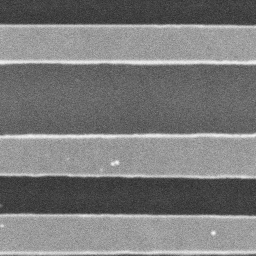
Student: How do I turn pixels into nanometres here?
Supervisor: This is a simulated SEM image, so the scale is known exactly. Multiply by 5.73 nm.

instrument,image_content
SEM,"lines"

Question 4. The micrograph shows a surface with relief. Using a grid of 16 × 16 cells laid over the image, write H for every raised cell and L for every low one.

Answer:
LLLLLLLLLLLLLLLL
LLLLLLLLLLLLLLLL
HHHHHHHHHHHHHHHH
HHHHHHHHHHHHHHHH
LLLLLLLLLLLLLLLL
LLLLLLLLLLLLLLLL
LLLLLLLLLLLLLLLL
LLLLLLLLLLLLLLLL
LLLLLLLLHLLLHHHH
HHHHHHHHHHHHHHHH
HHHHHHHHHHHHHHHH
LLLLLLLLLLLLLLLL
LLLLLLLLLLLLLLLL
HHHHHHHHHHHHHHLL
HHHHHHHHHHHHHHHH
HHHHHHHHHHHHHHHH